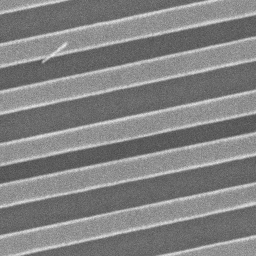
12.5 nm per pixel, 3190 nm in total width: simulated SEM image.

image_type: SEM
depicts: lines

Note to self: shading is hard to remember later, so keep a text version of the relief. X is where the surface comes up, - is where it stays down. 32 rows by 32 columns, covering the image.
XXXXXX------------------XXXXXXXX
X------------------XXXXXXXXXXXXX
---------------XXXXXXXXXXXXXX---
----------XXXXXXXXXXXXXX--------
-----XXXXXXXXXXXXXX-------------
XXXXXXXXXXXXXX--------------XXXX
XXXXXXXXX--------------XXXXXXXXX
XXXXXX------------XXXXXXXXXXXXXX
--------------XXXXXXXXXXXXXX----
---------XXXXXXXXXXXXXX---------
----XXXXXXXXXXXXXX--------------
XXXXXXXXXXXXXX-----------------X
XXXXXXXX------------------XXXXXX
XXXX-----------------XXXXXXXXXXX
----------------XXXXXXXXXXXXXX--
------------XXXXXXXXXXXXX-------
-------XXXXXXXXXXXXXX-----------
--XXXXXXXXXXXXXX-----------XXXXX
XXXXXXXXXXX-----------XXXXXXXXXX
XXXXXX------------XXXXXXXXXXXXXX
X-----------XXXXXXXXXXXXXXX-----
--------XXXXXXXXXXXXXX----------
--XXXXXXXXXXXXXXX---------------
XXXXXXXXXXXX-----------------XXX
XXXXXXX-----------------XXXXXXXX
XX-----------------XXXXXXXXXXXXX
--------------XXXXXXXXXXXXXX----
----------XXXXXXXXXXXXX---------
-----XXXXXXXXXXXXX--------------
XXXXXXXXXXXXXX------------------
XXXXXXXXX------------------XXXXX
XXXX------------------XXXXXXXXXX